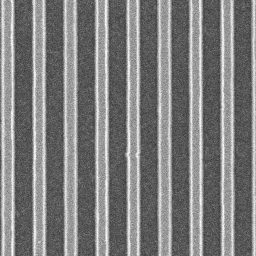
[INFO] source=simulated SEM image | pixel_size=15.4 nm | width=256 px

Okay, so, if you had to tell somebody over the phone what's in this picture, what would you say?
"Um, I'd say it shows parallel lines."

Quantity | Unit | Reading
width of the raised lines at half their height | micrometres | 0.187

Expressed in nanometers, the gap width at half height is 304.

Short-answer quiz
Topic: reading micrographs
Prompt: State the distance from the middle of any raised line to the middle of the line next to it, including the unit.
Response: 483 nm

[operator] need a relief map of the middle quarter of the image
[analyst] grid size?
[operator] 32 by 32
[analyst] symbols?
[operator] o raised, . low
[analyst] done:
ooo.....ooo.....ooo.....oo......
ooo.....ooo.....ooo.....oo......
ooo.....ooo.....ooo.....oo......
ooo.....ooo.....ooo.....oo......
ooo.....ooo.....ooo.....ooo.....
ooo.....ooo.....ooo.....oo......
ooo.....ooo.....ooo.....oo......
ooo.....ooo.....ooo.....oo......
ooo.....ooo.....ooo.....oo......
ooo.....ooo.....ooo.....ooo.....
ooo.....ooo.....ooo.....oo......
ooo.....ooo.....ooo.....oo......
ooo.....ooo.....ooo.....oo......
ooo.....ooo.....ooo.....oo......
ooo.....ooo.....ooo.....oo......
ooo.....ooo.....ooo.....oo......
ooo.....ooo.....ooo.....oo......
ooo.....ooo.....ooo.....oo......
ooo.....ooo.....ooo.....oo......
ooo.....ooo.....ooo.....oo......
ooo.....ooo.....ooo.....ooo.....
ooo.....ooo.....ooo.....oo......
ooo.....ooo.....ooo.....oo......
ooo.....ooo.....ooo.....oo......
ooo.....ooo.....ooo.....oo......
ooo.....ooo.....ooo.....oo......
ooo.....ooo.....ooo.....oo......
ooo.....ooo.....ooo.....oo......
ooo.....ooo.....ooo.....oo......
ooo.....ooo.....ooo.....oo......
ooo.....ooo.....ooo.....oo......
ooo.....ooo.....ooo.....oo......